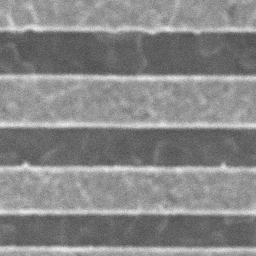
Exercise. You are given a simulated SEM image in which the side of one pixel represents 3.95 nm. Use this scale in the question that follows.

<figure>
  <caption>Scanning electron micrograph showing one or a few lines or trenches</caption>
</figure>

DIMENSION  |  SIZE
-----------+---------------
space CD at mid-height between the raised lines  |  160 nm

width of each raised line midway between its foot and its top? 178 nm